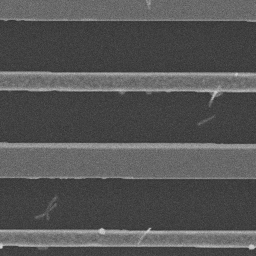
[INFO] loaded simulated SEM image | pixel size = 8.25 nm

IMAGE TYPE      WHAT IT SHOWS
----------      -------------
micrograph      lines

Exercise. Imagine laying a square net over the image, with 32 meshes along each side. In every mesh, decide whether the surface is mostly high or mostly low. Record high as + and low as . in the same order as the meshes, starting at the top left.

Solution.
++++++++++++++++++++++++++++++++
++++++++++++++++++++++++++++++++
+.++++++++++++++++++++++++++++++
................................
................................
................................
................................
................................
................................
++++++++++++++++++++++++++++++++
++++++++++++++++++++++++++++++++
..........................+.....
................................
................................
................................
................................
................................
................................
++++++++++++++++++++++++++++++++
++++++++++++++++++++++++++++++++
++++++++++++++++++++++++++++++++
++++++++++++++++++++++++++++++++
................................
................................
................................
................................
................................
................................
................................
++++++++++++++++++++++++++++++++
++++++++++++++++++++++++++++++++
................................